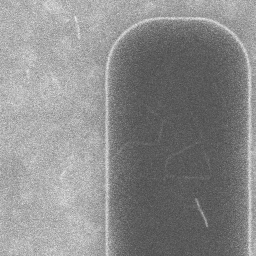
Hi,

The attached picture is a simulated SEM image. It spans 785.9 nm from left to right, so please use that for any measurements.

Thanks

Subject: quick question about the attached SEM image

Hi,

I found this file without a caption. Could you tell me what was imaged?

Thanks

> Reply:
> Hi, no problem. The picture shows one or a few lines or trenches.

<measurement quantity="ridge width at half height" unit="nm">441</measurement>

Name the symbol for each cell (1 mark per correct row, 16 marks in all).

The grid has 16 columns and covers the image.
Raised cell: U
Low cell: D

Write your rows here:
DDDDDDDDDDDDDDDD
DDDDDDDDDUUUUUDD
DDDDDDDUUUUUUUUD
DDDDDDDUUUUUUUUD
DDDDDDDUUUUUUUUU
DDDDDDDUUUUUUUUU
DDDDDDDUUUUUUUUU
DDDDDDDUUUUUUUUU
DDDDDDDUUUUUUUUU
DDDDDDDUUUUUUUUU
DDDDDDDUUUUUUUUU
DDDDDDDUUUUUUUUU
DDDDDDDUUUUUUUUU
DDDDDDDUUUUUUUUU
DDDDDDDUUUUUUUUU
DDDDDDDUUUUUUUUU